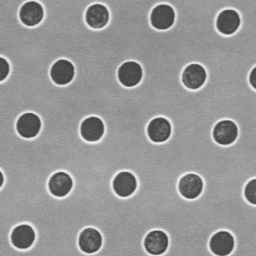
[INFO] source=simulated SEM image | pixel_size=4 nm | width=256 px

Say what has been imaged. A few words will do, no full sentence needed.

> a regular array of holes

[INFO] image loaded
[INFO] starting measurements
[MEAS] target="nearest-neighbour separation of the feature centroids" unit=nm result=254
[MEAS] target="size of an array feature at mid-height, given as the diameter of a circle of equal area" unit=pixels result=25.4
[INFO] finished